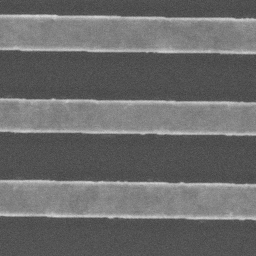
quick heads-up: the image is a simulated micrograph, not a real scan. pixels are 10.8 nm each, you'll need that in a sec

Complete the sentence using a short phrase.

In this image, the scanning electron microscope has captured lines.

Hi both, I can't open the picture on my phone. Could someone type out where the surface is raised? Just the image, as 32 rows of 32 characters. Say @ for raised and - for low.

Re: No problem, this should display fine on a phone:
--------------------------------
--------------------------------
@@@@@@@@@@@@@@@@@@@@@@@@@@@@@@@@
@@@@@@@@@@@@@@@@@@@@@@@@@@@@@@@@
@@@@@@@@@@@@@@@@@@@@@@@@@@@@@@@@
@@@@@@@@@@@@@@@@@@@@@@@@@@@@@@@@
----------------------@@@@@@@@@@
--------------------------------
--------------------------------
--------------------------------
--------------------------------
--------------------------------
@-------------------------------
@@@@@@@@@@@@@@@@@@@@@@@@@@@@@@@@
@@@@@@@@@@@@@@@@@@@@@@@@@@@@@@@@
@@@@@@@@@@@@@@@@@@@@@@@@@@@@@@@@
---@@@@@@@@@@@@@@@@@@@@@@@@@@@@@
--------------------------------
--------------------------------
--------------------------------
--------------------------------
--------------------------------
--------------------------------
@@@@@@@@@@@@@@@@@@@@@@@@@@@@@@@@
@@@@@@@@@@@@@@@@@@@@@@@@@@@@@@@@
@@@@@@@@@@@@@@@@@@@@@@@@@@@@@@@@
@@@@@@@@@@@@@@@@@@@@@@@@@@@@@@@@
--------------------------------
--------------------------------
--------------------------------
--------------------------------
--------------------------------